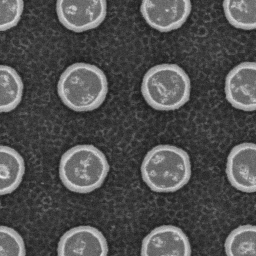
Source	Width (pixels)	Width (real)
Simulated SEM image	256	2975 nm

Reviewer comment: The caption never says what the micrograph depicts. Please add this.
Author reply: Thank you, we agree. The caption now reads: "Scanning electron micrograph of raised bodies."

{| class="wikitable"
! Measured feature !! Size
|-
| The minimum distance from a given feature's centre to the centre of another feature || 81.7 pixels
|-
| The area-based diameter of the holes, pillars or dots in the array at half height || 510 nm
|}